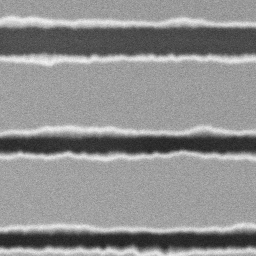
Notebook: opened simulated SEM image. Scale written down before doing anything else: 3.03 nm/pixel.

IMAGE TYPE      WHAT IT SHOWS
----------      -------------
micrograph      lines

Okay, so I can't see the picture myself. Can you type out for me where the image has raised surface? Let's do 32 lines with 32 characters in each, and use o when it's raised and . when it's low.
oooooooooooooooooooooooooooooooo
oooooooooooooooooooooooooooooooo
oooooooooooooooooooooooooooooooo
................................
................................
................................
................................
oooooooooooooooooooooooooooooooo
oooooooooooooooooooooooooooooooo
oooooooooooooooooooooooooooooooo
oooooooooooooooooooooooooooooooo
oooooooooooooooooooooooooooooooo
oooooooooooooooooooooooooooooooo
oooooooooooooooooooooooooooooooo
oooooooooooooooooooooooooooooooo
oooooooooooooooooooooooooooooooo
oooooooooooooooooooooooooooooooo
................................
................................
oooooooooooooooooooooooooooooooo
oooooooooooooooooooooooooooooooo
oooooooooooooooooooooooooooooooo
oooooooooooooooooooooooooooooooo
oooooooooooooooooooooooooooooooo
oooooooooooooooooooooooooooooooo
oooooooooooooooooooooooooooooooo
oooooooooooooooooooooooooooooooo
oooooooooooooooooooooooooooooooo
oooooooooooooooooooooooooooooooo
................................
................................
oooooooooooooooooooooooooooooooo